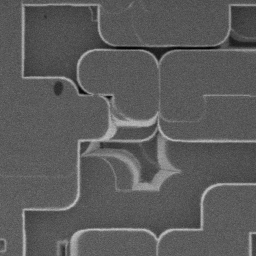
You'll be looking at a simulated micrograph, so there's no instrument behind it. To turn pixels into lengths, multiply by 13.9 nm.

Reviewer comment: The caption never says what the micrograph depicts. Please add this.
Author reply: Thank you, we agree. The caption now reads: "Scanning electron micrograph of wiring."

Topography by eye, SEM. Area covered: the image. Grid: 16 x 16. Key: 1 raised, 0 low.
1100001111111110
1000001111111100
1000000111111100
1000011111111111
1100011111111111
1111111111111111
1111111111111111
1111111111111111
1111111000111111
1111100000000000
1111100000000000
1111100000000000
1111100000000111
1100000000000111
1100011110111111
1100011111111111